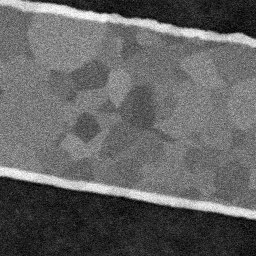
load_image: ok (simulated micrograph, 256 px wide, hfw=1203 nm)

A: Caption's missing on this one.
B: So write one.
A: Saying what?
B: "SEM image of one or a few lines or trenches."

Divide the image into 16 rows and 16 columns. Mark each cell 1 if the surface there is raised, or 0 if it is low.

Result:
1110000000000000
1111111110000000
1111111111111110
1111111111111111
1111111111111111
1111111111111111
1111111111111111
1111111111111111
1111111111111111
1111111111111111
1111111111111111
0000111111111111
0000000000111111
0000000000000000
0000000000000000
0000000000000000